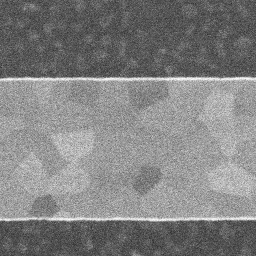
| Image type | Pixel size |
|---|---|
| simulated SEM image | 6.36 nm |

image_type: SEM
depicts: one or a few lines or trenches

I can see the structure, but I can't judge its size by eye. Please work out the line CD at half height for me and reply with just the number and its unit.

899 nm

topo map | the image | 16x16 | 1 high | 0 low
0000000000000000
0000000000000000
0000000000000000
0000000000000000
0000000000000000
1111111111111111
1111111111111111
1111111111111111
1111111111111111
1111111111111111
1111111111111111
1111111111111111
1111111111111111
1111111111111111
0000000000000000
0000000000000000